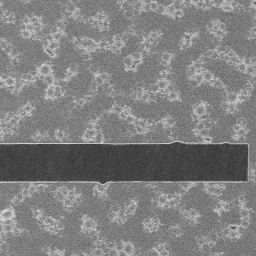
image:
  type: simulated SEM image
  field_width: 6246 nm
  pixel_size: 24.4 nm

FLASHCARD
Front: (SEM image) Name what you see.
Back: one or a few lines or trenches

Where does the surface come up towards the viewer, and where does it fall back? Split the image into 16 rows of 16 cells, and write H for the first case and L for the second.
HHHHHHHHHHHHHHHH
HHHHHHHHHHHHHHHH
HHHHHHHHHHHHHHHH
HHHHHHHHHHHHHHHH
HHHHHHHHHHHHHHHH
HHHHHHHHHHHHHHHH
HHHHHHHHHHHHHHHH
HHHHHHHHHHHHHHHH
HHHHHHHHHHHHHHHH
LLLLLLLLLLLLLLLL
LLLLLLLLLLLLLLLL
HHHHHHHHHHHHHHHH
HHHHHHHHHHHHHHHH
HHHHHHHHHHHHHHHH
HHHHHHHHHHHHHHHH
HHHHHHHHHHHHHHHH